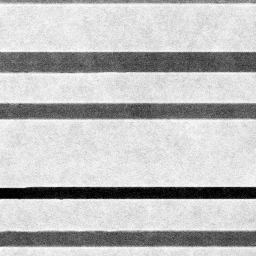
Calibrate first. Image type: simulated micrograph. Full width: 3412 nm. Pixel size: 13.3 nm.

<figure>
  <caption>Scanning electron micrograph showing lines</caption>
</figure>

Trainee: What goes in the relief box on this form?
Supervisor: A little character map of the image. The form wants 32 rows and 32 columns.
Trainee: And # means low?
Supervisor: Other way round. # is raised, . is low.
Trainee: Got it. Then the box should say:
................................
################################
################################
################################
################################
################################
................................
................................
................................
################################
################################
################################
################################
................................
................................
################################
################################
################################
################################
################################
################################
################################
################################
................................
................................
################################
################################
################################
################################
................................
................................
################################